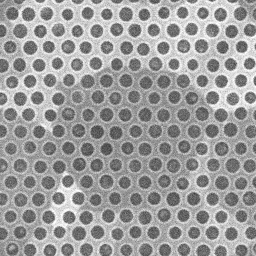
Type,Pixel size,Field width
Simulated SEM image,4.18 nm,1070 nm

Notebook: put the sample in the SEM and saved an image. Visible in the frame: a regular array of holes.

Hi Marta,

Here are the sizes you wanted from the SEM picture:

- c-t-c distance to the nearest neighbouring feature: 0.0755 um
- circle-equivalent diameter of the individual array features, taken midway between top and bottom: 58.7 nanometers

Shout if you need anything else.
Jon